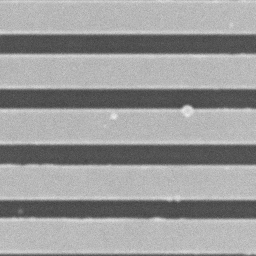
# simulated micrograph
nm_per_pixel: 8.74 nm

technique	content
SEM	lines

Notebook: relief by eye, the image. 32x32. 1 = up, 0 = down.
11111111111111111111111111111111
11111111111111111111111111111111
11111111111111111111111111111111
11111111111111111111111111111111
00000000000000000000000000000000
00000000000000000000000000000000
00000000000000000000000000000000
11111111111111111111111111111111
11111111111111111111111111111111
11111111111111111111111111111111
11111111111111111111111111111111
00000000000000000000000000000000
00000000000000000000000000000000
00000000000000000000000100000000
11111111111111111111111111111111
11111111111111111111111111111111
11111111111111111111111111111111
11111111111111111111111111111111
00000000000000000000000000000000
00000000000000000000000000000000
00000000000000000000000000000000
11111111111111111111111111111111
11111111111111111111111111111111
11111111111111111111111111111111
11111111111111111111111111111111
00000000000000000000000000000000
00000000000000000000000000000000
11111111101101111001000000000000
11111111111111111111111111111111
11111111111111111111111111111111
11111111111111111111111111111111
11111111111111111111111111111111